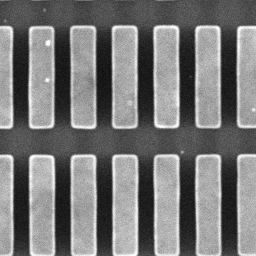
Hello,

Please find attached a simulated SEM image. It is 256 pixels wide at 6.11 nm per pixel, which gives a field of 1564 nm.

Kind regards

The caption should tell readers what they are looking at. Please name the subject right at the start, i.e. groups of lines, slits or small figures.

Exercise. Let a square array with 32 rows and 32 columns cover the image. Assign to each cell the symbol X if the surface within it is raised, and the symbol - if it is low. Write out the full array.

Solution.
--------------------------------
--------------------------------
--------------------------------
X---XX---XXX--XXX---XX---XX---XX
X---XXX--XXX--XXX--XXX---XX---XX
X---XXX--XXX--XXX--XXX---XX---XX
X---XXX--XXX--XXX--XXX---XX---XX
X---XXX--XXX--XXX--XXX---XX---XX
X---XXX--XXX--XXX--XXX---XX---XX
X---XXX--XXX--XXX--XXX---XX---XX
X---XXX--XXX--XXX--XXX--XXX---XX
X---XXX--XXX--XXX--XXX--XXX---XX
X---XXX--XXX--XXX--XXX---XX---XX
X---XXX--XXX--XXX--XXX---XXX--XX
X---XXX--XXX--XXX--XXX---XXX--XX
X---XXX--XXX--XXX---XX---XX---XX
--------------------------------
--------------------------------
--------------------------------
X---XX---XXX---XX---XX---XX---XX
XX--XXX--XXX--XXX--XXX---XXX--XX
XX--XXX--XXX--XXX--XXX---XXX--XX
XX--XXX--XXX--XXX--XXX---XXX--XX
XX--XXX--XXX--XXX--XXX---XXX--XX
XX--XXX--XXX--XXX--XXX---XXX--XX
XX--XXX--XXX--XXX--XXX---XXX--XX
XX--XXX--XXX--XXX--XXX---XXX--XX
XX--XXX--XXX--XXX--XXX---XXX--XX
XX--XXX--XXX--XXX--XXX---XXX--XX
XX--XXX--XXX--XXX--XXX---XXX--XX
XX--XXX--XXX--XXX--XXX---XXX--XX
XX--XXX--XXX--XXX--XXX---XXX--XX